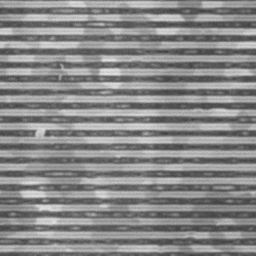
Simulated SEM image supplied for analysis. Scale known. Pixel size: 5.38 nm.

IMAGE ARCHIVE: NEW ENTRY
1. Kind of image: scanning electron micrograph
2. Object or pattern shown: parallel lines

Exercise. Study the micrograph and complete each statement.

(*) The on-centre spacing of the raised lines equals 73.1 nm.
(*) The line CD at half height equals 24.9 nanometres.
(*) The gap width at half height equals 0.0498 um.